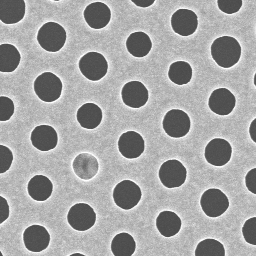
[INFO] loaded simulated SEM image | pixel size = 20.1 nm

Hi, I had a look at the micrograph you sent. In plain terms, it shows a regular array of holes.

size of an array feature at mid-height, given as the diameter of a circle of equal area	554	nm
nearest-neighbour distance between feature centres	1010	nanometres